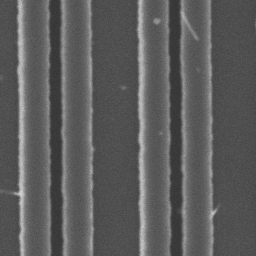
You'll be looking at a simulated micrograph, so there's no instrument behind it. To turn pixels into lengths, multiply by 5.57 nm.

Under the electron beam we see lines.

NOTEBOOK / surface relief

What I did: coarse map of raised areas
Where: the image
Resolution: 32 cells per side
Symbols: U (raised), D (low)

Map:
DDUUUUDDUUUDDDDDDUUUUDDUUUDDDDDD
DDUUUUDDUUUDDDDDDUUUUDDUUUDDDDDD
DDUUUUDDUUUDDDDDDUUUUDDUUUDDDDDD
DDUUUUDDUUUDDDDDDUUUUDDUUUDDDDDD
DDUUUUDDUUUDDDDDDUUUUDDUUUDDDDDD
DDUUUUDDUUUDDDDDDUUUUDDUUUDDDDDD
DDUUUUDDUUUDDDDDDUUUUDDUUUDDDDDD
DDUUUUDDUUUDDDDDDUUUUDDUUUDDDDDD
DDUUUUDDUUUDDDDDDDUUUDDUUUDDDDDD
DDUUUUDDUUUDDDDDDDUUUDDUUUDDDDDD
DDUUUUDDUUUDDDDDDDUUUDDUUUDDDDDD
DDUUUUDDUUUUDDDDDUUUUDDUUUDDDDDD
DDDUUUDDUUUDDDDDDUUUUDDUUUDDDDDD
DDDUUUDDUUUUDDDDDUUUUDDUUUDDDDDD
DDUUUUDDUUUDDDDDDUUUUDDUUUDDDDDD
DDDUUUDDUUUDDDDDDDUUUDDUUUDDDDDD
DDUUUUDDUUUDDDDDDDUUUDDUUUDDDDDD
DDUUUUDDUUUDDDDDDUUUUDDUUUDDDDDD
DDUUUUDDUUUUDDDDDDUUUDDUUUDDDDDD
DDUUUUDDUUUUDDDDDDUUUDDUUUDDDDDD
DDUUUUDDUUUUDDDDDUUUUDDUUUDDDDDD
DDDUUUDDUUUUDDDDDDUUUDDUUUDDDDDD
DDUUUUDDUUUUDDDDDDUUUDDUUUDDDDDD
DDUUUUDDUUUUDDDDDDUUUDDUUUDDDDDD
DDUUUUDDUUUUDDDDDDUUUDDUUUDDDDDD
DDDUUUDDUUUUDDDDDDUUUDDUUUDDDDDD
DDDUUUDDUUUUDDDDDDUUUDDUUUUDDDDD
DDDUUUDDUUUUDDDDDDUUUDDUUUDDDDDD
DDDUUUDDUUUUDDDDDDUUUDDUUUUDDDDD
DDUUUUDDUUUUDDDDDDUUUDDUUUUDDDDD
DDDUUUDDUUUUDDDDDDUUUDDUUUUDDDDD
DDDUUUDDUUUUDDDDDDUUUDDUUUDDDDDD